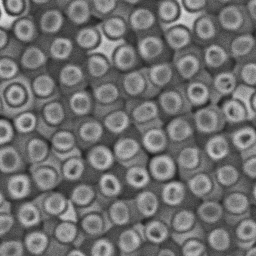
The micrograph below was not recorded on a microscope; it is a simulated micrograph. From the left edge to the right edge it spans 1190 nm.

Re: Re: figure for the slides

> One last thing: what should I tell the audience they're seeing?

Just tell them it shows a regular array of raised bodies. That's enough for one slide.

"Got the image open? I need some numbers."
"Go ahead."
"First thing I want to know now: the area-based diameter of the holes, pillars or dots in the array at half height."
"0.0869 micrometres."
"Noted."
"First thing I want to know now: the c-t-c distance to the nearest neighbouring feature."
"129 nm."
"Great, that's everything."